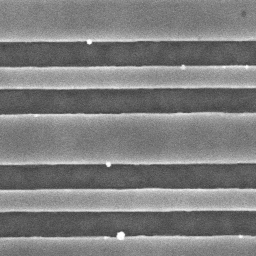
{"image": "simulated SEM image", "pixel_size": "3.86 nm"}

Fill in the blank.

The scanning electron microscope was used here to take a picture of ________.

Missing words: lines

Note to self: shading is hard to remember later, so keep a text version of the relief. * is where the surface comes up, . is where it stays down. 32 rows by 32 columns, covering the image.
********************************
********************************
********************************
********************************
********************************
................................
................................
................................
*..**.**************************
********************************
********************************
................................
................................
................................
********************************
********************************
********************************
********************************
********************************
********************************
***..........*..................
................................
................................
................................
********************************
********************************
*...............................
................................
................................
..............**.*.*..*....*****
********************************
********************************